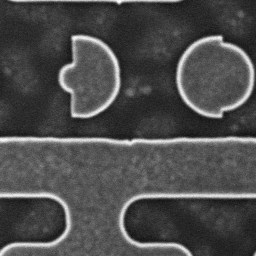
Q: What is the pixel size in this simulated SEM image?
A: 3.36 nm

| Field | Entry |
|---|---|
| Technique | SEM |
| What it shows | one or a few lines or trenches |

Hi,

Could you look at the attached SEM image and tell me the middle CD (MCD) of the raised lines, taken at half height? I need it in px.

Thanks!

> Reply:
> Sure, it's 57.2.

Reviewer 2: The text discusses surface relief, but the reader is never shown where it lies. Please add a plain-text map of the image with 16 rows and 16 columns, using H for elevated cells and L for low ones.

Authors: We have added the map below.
LLLLLLLLLLLLLLLL
LLLLLLLLLLLLLLLL
LLLLLHLLLLLLLHLL
LLLLLHHLLLLLHHHL
LLLLHHHLLLLHHHHH
LLLLHHHLLLLHHHHH
LLLLHHHLLLLLHHHL
LLLLLLLLLLLLLLLL
LLLLLLLLLLLLLLLL
HHHHHHHHHHHHHHHH
HHHHHHHHHHHHHHHH
HHHHHHHHHHHHHHHH
LLLLHHHHLLLLLLLL
LLLLHHHHLLLLLLLL
LLLLHHHHLLLLLLLL
HHHHHHHHHHHLLLLL